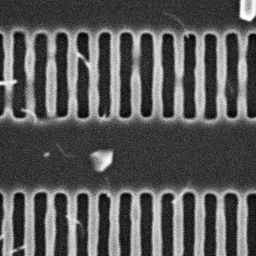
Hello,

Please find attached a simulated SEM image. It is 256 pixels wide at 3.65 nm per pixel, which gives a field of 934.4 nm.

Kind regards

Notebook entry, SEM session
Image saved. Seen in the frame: groups of lines, slits or small figures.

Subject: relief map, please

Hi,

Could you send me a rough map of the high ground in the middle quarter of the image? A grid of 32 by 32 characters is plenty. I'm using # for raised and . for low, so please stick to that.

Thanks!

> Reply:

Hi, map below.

.##...##....##....#....#....##..
.##...##....##...##....#....##..
.##....##...##...##....#....##..
.##....##...##...##....#....#...
.##....#....##...##....#....#...
.##....#....##...##...##....#...
.##...##....##...##...##....#...
.##...###...##...##...##....##..
.##...###...##...##...##....##..
.##...###...##...##...##....#...
.##...###...##...##...##....#...
.##...##....##...##...##....#...
.##...###...##...##...##....#...
####..########..####.####..###..
################################
################################
################################
################################
################################
################################
################################
################################
################################
################################
################################
################################
################################
################################
################################
################################
################################
################################